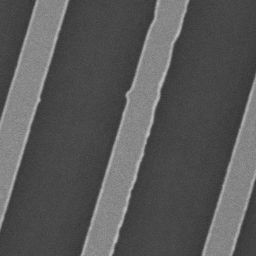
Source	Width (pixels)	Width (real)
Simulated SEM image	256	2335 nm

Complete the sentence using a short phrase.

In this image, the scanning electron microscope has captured one or a few lines or trenches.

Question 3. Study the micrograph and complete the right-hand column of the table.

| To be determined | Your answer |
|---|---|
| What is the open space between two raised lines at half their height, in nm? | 792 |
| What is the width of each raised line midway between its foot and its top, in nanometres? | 269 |